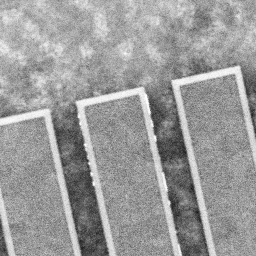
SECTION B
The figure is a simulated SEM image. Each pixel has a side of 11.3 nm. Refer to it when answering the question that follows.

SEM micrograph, one or a few lines or trenches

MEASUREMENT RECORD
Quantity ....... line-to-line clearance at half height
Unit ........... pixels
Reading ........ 32.8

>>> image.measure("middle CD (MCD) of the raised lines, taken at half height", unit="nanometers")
737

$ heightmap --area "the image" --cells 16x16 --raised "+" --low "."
................
................
................
................
..............+.
...........++++.
.....++++..++++.
+++..++++..+++++
+++..+++++..++++
+++...++++..++++
++++..++++..++++
++++..++++..++++
++++..++++...+++
++++..+++++..+++
+++++..++++..+++
.++++..++++..+++